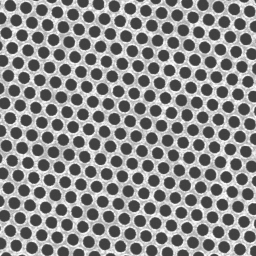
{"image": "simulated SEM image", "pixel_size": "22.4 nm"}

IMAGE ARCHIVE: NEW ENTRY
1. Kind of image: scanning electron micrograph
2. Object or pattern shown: a regular array of holes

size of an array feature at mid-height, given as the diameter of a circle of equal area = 274 nm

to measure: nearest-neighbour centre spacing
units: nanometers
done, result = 353